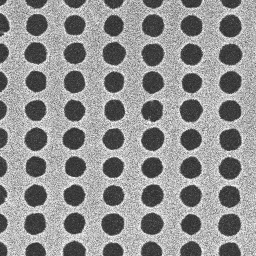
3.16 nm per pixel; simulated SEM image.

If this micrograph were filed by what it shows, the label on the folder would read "a regular array of holes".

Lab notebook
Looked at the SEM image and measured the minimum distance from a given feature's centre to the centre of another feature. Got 28.1 px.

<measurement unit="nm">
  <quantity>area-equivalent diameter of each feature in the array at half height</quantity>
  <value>69.7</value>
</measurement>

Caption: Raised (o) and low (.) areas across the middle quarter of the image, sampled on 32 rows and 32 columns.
ooooooooooooooooooooo..ooooooooo
oooooooooooooooooooooooooooooooo
o....oooooo...oooooo....ooooooo.
.....ooooo.....ooooo.....ooooo..
.....ooooo.....oooo......oooo...
.....ooooo.....ooooo.....ooooo..
o....oooooo...oooooo....oooooo..
oooooooooooooooooooooooooooooooo
oooooooooooooooooooooooooooooooo
o...ooooooo...ooooooo...oooooo..
.....ooooo.....ooooo.....oooo...
.....ooooo.....oooo......oooo...
.....ooooo.....oooo......oooo...
o....oooooo....ooooo....oooooo..
oooooooooooooooooooooo.oooooooo.
oooooooooooooooooooooooooooooooo
o...ooooooo...oooooo....ooooooo.
.....ooooo.....ooooo.....oooo...
.....ooooo.....oooo......oooo...
.....ooooo.....oooo......oooo...
.....ooooo.....ooooo....oooooo..
oooooooooooo.oooooooo..oooooooo.
oooooooooooooooooooooooooooooooo
o...ooooooo...ooooooo..oooooooo.
.....ooooo.....ooooo....oooooo..
.....ooooo.....oooo......oooo...
.....ooooo.....oooo......oooo...
o....ooooo....oooooo....ooooo...
oooooooooooo.oooooooo.ooooooooo.
oooooooooooooooooooooooooooooooo
oo..ooooooo..oooooooo...ooooooo.
.....ooooo.....ooooo.....ooooo..